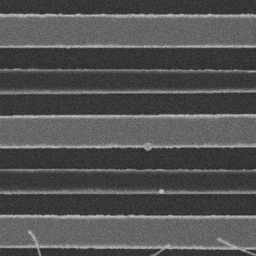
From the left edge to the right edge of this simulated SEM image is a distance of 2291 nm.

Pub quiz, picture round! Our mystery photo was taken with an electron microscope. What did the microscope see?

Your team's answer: lines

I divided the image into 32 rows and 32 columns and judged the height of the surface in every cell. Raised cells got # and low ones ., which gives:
................................
................................
################################
################################
################################
################################
................................
................................
................................
################################
################################
................................
................................
................................
..............##################
################################
################################
################################
..................#.............
................................
................................
################################
################################
################################
................................
................................
................................
################################
################################
################################
################################
................................